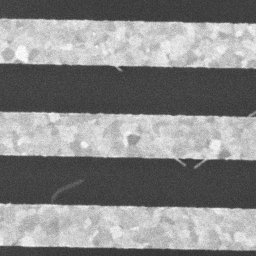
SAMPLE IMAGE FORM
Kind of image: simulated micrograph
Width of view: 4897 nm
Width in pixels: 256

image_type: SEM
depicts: lines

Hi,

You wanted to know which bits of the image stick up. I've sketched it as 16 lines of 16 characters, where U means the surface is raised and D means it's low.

DDDDDDDDDDDDDDDD
UUUUUUUUUUUUUUUU
UUUUUUUUUUUUUUUU
UUUUUUUUUUUUUUUU
DDDDDDDDDDDDDDDD
DDDDDDDDDDDDDDDD
DDDDDDDDDDDDDDDD
UUUUUUUUUUUUUUUU
UUUUUUUUUUUUUUUU
UUUUUUUUUUUUUUUU
DDDDDDDDDDDDDDDD
DDDDDDDDDDDDDDDD
DDDDDDDDDDDDDDDD
UUUUUUUUUUUUUUUU
UUUUUUUUUUUUUUUU
DDDDDDDDDDUUUUUU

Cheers